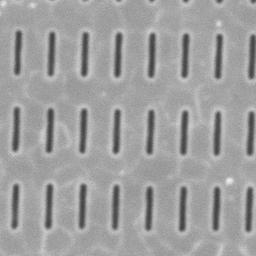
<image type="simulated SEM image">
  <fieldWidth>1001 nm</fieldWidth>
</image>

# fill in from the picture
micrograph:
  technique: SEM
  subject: a regular array of holes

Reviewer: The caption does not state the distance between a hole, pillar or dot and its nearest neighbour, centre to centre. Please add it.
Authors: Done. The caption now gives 131 nanometres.